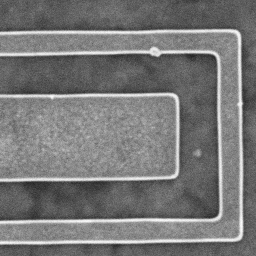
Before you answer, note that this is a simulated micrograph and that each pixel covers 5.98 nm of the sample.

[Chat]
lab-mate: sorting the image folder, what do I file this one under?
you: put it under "groups of lines, slits or small figures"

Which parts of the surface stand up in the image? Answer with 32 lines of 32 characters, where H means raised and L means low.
LLLLLLLLLLLLLLLLLLLLLLLLLLLLLLLL
LLLLLLLLLLLLLLLLLLLLLLLLLLLLLLLL
LLLLLLLLLLLLLLLLLLLLLLLLLLLLLLLL
LLLLLLLLLLLLLLLLLLLLLLLLLLLLLLLL
HHHHHHHHHHHHHHHHHHHHHHHHHHHHHHLL
HHHHHHHHHHHHHHHHHHHHHHHHHHHHHHLL
HHHHHHHHHHHHHHHHHHHHHHHLHHHHHHLL
LLLLLLLLLLLLLLLLLLLLLLLLLLLHHHLL
LLLLLLLLLLLLLLLLLLLLLLLLLLLHHHLL
LLLLLLLLLLLLLLLLLLLLLLLLLLLHHHLL
LLLLLLLLLLLLLLLLLLLLLLLLLLLHHHLL
LLLLLLLLLLLLLLLLLLLLLLLLLLLHHHLL
HHHHHHHHHHHHHHHHHHHHHHLLLLLHHHLL
HHHHHHHHHHHHHHHHHHHHHHLLLLLHHHLL
HHHHHHHHHHHHHHHHHHHHHHLLLLLHHHLL
HHHHHHHHHHHHHHHHHHHHHHLLLLLHHHLL
HHHHHHHHHHHHHHHHHHHHHHLLLLLHHHLL
HHHHHHHHHHHHHHHHHHHHHHLLLLLLHHLL
HHHHHHHHHHHHHHHHHHHHHHLLLLLLHHLL
HHHHHHHHHHHHHHHHHHHHHHLLLLLLHHLL
HHHHHHHHHHHHHHHHHHHHHHLLLLLLHHLL
HHHHHHHHHHHHHHHHHHHHHHLLLLLLHHLL
LLLLLLLLLLLLLLLLLLLLLLLLLLLLHHLL
LLLLLLLLLLLLLLLLLLLLLLLLLLLLHHLL
LLLLLLLLLLLLLLLLLLLLLLLLLLLLHHLL
LLLLLLLLLLLLLLLLLLLLLLLLLLLLHHLL
LLLLLLLLLLLLLLLLLLLLLLLLLLLLHHLL
LLLLLLLLLLLLLLLLHHHHHHLLLLHHHHLL
HHHHHHHHHHHHHHHHHHHHHHHHHHHHHHLL
HHHHHHHHHHHHHHHHHHHHHHHHHHHHHHLL
LLLLLLLLLLLLLLLLLLLLLLLLLLLLLLLL
LLLLLLLLLLLLLLLLLLLLLLLLLLLLLLLL